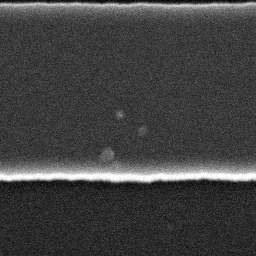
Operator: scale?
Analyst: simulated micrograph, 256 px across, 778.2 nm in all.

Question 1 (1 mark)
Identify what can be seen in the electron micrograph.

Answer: lines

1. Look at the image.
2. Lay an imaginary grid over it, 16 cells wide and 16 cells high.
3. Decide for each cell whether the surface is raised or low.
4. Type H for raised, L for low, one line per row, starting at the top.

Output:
HHHHHHHHHHHHHHHH
HHHHHHHHHHHHHHHH
HHHHHHHHHHHHHHHH
HHHHHHHHHHHHHHHH
HHHHHHHHHHHHHHHH
HHHHHHHHHHHHHHHH
HHHHHHHHHHHHHHHH
HHHHHHHHHHHHHHHH
HHHHHHHHHHHHHHHH
HHHHHHHHHHHHHHHH
HHHHHHHHHHHHHHHH
LLLLLLLLLLLLLLLL
LLLLLLLLLLLLLLLL
LLLLLLLLLLLLLLLL
LLLLLLLLLLLLLLLL
LLLLLLLLLLLLLLLL